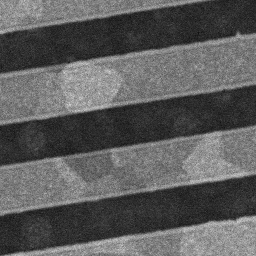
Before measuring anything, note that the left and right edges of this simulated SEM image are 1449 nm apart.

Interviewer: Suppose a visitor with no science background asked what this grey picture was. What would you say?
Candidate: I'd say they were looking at one or a few lines or trenches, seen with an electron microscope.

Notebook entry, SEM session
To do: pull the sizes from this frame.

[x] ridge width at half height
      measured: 253 nanometers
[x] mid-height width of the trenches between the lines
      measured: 251 nanometres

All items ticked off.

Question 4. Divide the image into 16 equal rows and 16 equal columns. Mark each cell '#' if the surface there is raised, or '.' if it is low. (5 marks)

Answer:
#########.......
###.............
..............##
........########
..##############
##############..
#######.........
#...............
.............###
......##########
################
###########.....
#####...........
................
...........#####
....############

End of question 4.